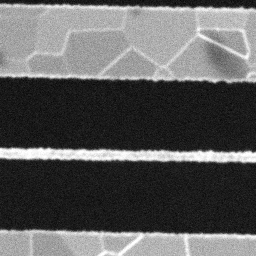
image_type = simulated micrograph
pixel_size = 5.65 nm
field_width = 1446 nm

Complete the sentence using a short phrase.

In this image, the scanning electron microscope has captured lines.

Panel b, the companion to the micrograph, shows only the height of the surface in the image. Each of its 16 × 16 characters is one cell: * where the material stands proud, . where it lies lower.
***********.....
****************
****************
****************
****************
................
................
................
................
......*.........
................
................
................
................
*****...........
****************